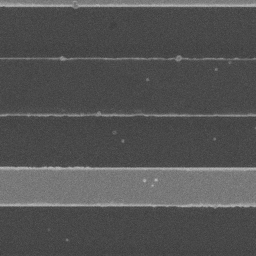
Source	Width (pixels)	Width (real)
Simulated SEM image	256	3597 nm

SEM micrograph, lines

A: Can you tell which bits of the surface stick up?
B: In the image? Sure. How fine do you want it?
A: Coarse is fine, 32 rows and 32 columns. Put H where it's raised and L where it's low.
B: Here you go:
HHHHHHHHHHHHHHHHHHHHHHHHHHHHHHHH
LLLLLLLLLLLLLLLLLLLLLLLLLLLLLLLL
LLLLLLLLLLLLLLLLLLLLLLLLLLLLLLLL
LLLLLLLLLLLLLLLLLLLLLLLLLLLLLLLL
LLLLLLLLLLLLLLLLLLLLLLLLLLLLLLLL
LLLLLLLLLLLLLLLLLLLLLLLLLLLLLLLL
LLLLLLLLLLLLLLLLLLLLLLLLLLLLLLLL
HHHHHHHHHHHHHHHHHHHHHHHHHHHHHHHH
HHHHHHHHHHHHHHHHHHHHHHHHHHHHHHHH
HHHHHHHHHHHHHHHHHHHHHHHHHHHHHHHH
HHHHHHHHHHHHHHHHHHHHHHHHHHHHHHHH
HHHHHHHHHHHHHHHHHHHHHHHHHHHHHHHH
HHHHHHHHHHHHHHHHHHHHHHHHHHHHHHHH
HHHHHHHHHHHHHHHHHHHHHHHHHHHHHHHH
LLLLLLLLLLLLLLLLLLLLLLLLLLLLLLLL
LLLLLLLLLLLLLLLLLLLLLLLLLLLLLLLL
LLLLLLLLLLLLLLLLLLLLLLLLLLLLLLLL
LLLLLLLLLLLLLLLLLLLLLLLLLLLLLLLL
LLLLLLLLLLLLLLLLLLLLLLLLLLLLLLLL
LLLLLLLLLLLLLLLLLLLLLLLLLLLLLLLL
LLLLLLLLLLLLLLLLLLLLLLLLLLLLLLLL
HHHHHHHHHHHHHHHHHHHHHHHHHHHHHHHH
HHHHHHHHHHHHHHHHHHHHHHHHHHHHHHHH
HHHHHHHHHHHHHHHHHHHHHHHHHHHHHHHH
HHHHHHHHHHHHHHHHHHHHHHHHHHHHHHHH
HHHHHHHHHHHHHHHHHHHHHHHHHHHHHHHH
LLLLLLLLLLLLLLLLLLLLLLLLLLLLLLLL
LLLLLLLLLLLLLLLLLLLLLLLLLLLLLLLL
LLLLLLLLLLLLLLLLLLLLLLLLLLLLLLLL
LLLLLLLLLLLLLLLLLLLLLLLLLLLLLLLL
LLLLLLLLLLLLLLLLLLLLLLLLLLLLLLLL
LLLLLLLLLLLLLLLLLLLLLLLLLLLLLLLL